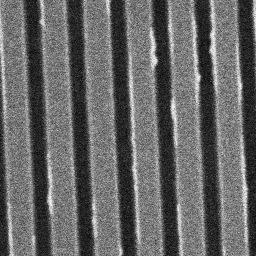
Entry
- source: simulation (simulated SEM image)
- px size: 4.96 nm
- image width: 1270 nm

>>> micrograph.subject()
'parallel lines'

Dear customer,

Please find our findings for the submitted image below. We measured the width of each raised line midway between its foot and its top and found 138 nm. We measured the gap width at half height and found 73.7 nm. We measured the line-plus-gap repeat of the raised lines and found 211 nanometres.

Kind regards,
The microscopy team